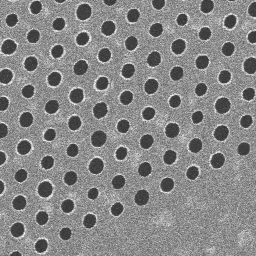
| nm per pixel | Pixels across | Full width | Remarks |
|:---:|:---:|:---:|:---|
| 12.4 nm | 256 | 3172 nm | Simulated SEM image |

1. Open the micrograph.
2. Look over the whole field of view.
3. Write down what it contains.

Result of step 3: a regular array of holes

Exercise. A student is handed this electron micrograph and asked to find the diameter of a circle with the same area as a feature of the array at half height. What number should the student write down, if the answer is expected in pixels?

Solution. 13.7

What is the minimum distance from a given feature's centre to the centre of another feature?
336 nm